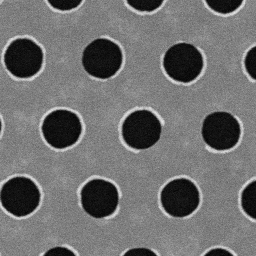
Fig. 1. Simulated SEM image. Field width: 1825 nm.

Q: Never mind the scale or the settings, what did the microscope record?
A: a regular array of holes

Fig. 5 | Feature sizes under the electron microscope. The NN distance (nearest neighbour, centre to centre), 78.4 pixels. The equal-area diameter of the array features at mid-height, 279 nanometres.